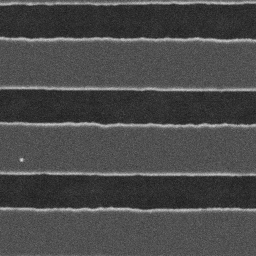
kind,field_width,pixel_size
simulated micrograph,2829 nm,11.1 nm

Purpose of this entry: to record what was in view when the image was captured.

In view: lines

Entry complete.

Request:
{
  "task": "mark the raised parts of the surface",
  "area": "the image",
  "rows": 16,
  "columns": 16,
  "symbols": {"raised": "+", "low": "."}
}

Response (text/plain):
................
................
++++++++++++++++
++++++++++++++++
++++++++++++++++
++++++++++++++++
................
................
++++++++++++++++
++++++++++++++++
++++++++++++++++
................
................
++++++++++++++++
++++++++++++++++
++++++++++++++++